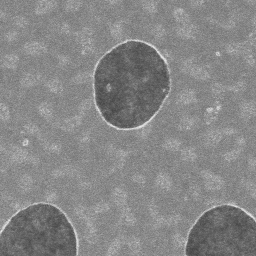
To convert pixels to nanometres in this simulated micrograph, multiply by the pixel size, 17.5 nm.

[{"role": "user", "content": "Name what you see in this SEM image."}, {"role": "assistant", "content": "holes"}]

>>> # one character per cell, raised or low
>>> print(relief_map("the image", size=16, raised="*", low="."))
****************
****************
****************
*******...******
******.....*****
******.....*****
******....******
*******..*******
****************
****************
****************
****************
****************
*...*********...
.....*******....
.....*******....